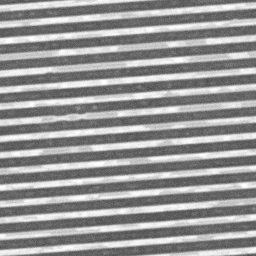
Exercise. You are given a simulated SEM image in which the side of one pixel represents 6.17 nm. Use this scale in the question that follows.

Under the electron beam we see parallel lines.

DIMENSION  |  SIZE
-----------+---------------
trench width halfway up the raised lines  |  0.0661 µm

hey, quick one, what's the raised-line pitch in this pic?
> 100 nm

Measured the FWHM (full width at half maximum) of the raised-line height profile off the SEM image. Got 0.03 micrometres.